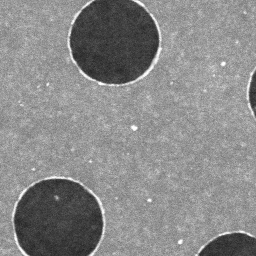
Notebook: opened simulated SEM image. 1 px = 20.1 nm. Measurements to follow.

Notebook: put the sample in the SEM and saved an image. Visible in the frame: holes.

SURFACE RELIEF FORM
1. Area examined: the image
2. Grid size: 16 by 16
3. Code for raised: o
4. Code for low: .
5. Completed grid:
ooooo....ooooooo
ooooo.....oooooo
oooo......oooooo
ooooo.....oooooo
ooooo....ooooooo
oooooooooooooooo
oooooooooooooooo
oooooooooooooooo
oooooooooooooooo
oooooooooooooooo
oooooooooooooooo
oo...ooooooooooo
o.....oooooooooo
o.....oooooooooo
o.....oooooooooo
o.....ooooooo...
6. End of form